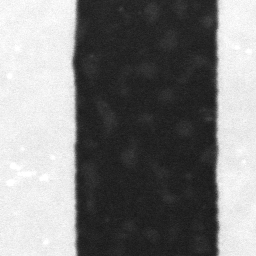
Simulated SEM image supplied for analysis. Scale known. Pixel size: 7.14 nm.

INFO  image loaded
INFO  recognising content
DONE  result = one or a few lines or trenches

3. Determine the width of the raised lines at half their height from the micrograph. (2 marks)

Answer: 1.05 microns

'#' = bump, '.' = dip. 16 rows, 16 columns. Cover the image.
.....#########..
.....#########..
.....#########..
....##########..
....##########..
.....#########..
.....#########..
.....#########..
.....#########..
.....#########..
.....#########..
.....#########..
.....#########..
.....#########..
.....#########..
.....#########..